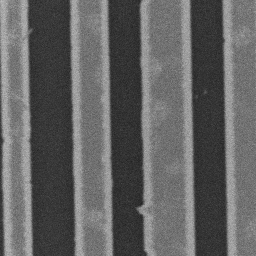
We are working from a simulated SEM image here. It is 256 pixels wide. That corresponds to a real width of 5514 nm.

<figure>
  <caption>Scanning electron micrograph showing one or a few lines or trenches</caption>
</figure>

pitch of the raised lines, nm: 1630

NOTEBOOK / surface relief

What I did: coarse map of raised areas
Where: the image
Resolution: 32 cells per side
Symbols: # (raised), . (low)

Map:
###......####.....#####.....####
###......####.....#####.....####
###......####.....#####.....####
###......####.....#####.....####
.##......####.....#####.....####
.##......####.....#####.....####
.##......####.....#####.....####
.##......####.....#####.....####
.##.......###.....#####.....####
.##.......###.....#####......###
.##.......###.....#####......###
.##.......###.....#####......###
.##......####.....#####......###
.##.......###.....#####......###
.##.......###.....######.....###
.##.......###.....######.....###
.##.......###.....######.....###
.##.......###.....######.....###
.##.......###.....######.....###
.##.......###.....######.....###
.##.......###.....######.....###
.##.......###.....######.....###
.##.......####....######.....###
.##.......####....######.....###
.##.......###.....######.....###
.##.......####....######.....###
.##.......####....######.....###
.##.......####....######.....###
.###......####....######.....###
.###......####....######.....###
.###......####.....#####.....###
.###......####.....#####.....###